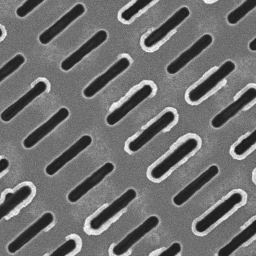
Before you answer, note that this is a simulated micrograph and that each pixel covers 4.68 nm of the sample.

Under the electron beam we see a regular array of holes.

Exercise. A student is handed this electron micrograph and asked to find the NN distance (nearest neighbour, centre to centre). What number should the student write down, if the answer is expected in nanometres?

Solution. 163